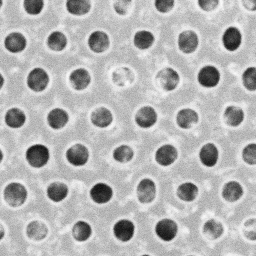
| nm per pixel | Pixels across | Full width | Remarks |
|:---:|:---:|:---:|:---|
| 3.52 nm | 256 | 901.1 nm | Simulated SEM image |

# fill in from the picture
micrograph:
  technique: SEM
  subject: a regular array of holes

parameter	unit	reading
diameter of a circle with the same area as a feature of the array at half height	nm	77.7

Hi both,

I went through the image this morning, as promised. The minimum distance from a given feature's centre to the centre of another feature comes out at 41.9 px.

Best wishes